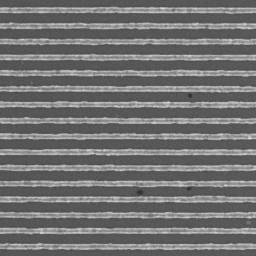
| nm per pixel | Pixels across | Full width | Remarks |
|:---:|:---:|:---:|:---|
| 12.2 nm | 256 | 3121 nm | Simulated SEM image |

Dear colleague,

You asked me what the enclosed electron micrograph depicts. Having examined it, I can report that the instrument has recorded parallel lines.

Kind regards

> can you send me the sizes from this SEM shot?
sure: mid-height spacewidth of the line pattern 145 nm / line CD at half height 42.7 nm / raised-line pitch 0.192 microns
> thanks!